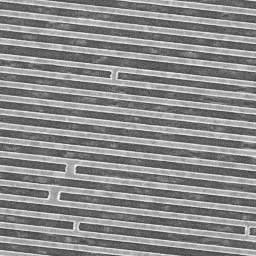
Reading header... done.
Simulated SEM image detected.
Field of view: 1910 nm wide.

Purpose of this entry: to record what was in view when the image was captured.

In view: parallel lines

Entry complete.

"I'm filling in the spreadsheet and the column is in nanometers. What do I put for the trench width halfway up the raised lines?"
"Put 63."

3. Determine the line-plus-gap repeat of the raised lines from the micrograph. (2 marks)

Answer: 0.105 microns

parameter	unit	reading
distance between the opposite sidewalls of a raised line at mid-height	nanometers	38.9